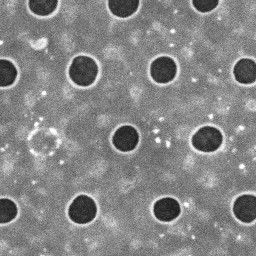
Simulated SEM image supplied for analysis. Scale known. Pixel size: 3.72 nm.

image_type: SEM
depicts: holes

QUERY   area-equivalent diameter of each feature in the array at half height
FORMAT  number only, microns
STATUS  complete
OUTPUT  0.107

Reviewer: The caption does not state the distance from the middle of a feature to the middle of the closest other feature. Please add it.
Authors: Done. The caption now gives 300 nanometres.